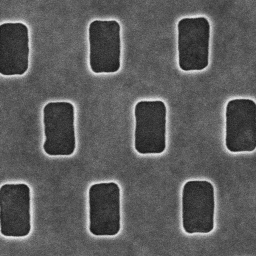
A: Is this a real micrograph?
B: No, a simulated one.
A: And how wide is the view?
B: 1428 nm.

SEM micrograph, holes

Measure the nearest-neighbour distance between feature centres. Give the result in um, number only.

0.509